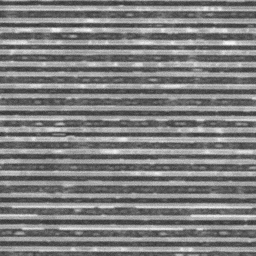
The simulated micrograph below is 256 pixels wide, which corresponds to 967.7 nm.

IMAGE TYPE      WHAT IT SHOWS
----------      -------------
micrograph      parallel lines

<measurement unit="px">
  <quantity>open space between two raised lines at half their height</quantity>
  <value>5.74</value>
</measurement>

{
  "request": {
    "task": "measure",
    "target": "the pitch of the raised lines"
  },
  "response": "0.0413 um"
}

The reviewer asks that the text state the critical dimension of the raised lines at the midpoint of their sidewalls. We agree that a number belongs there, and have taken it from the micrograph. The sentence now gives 14.6 nm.